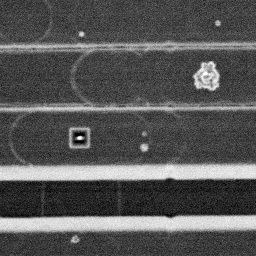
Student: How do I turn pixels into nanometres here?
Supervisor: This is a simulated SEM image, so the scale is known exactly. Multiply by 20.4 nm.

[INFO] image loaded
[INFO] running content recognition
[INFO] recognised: wiring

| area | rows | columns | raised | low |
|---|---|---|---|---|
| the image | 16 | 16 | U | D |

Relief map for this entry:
UUUUUUUUUUUUUUUU
UUUUUUUUUUUUUUUU
UUUUUUUUUUUUUUUU
UUUUUUUUUUUUUUUU
UUUUUUUUUUUUUUUU
UUUUUUUUUUUUUUUU
UUUUUUUUUUUUUUUU
UUUUUUUUUUUUUUUU
UUUUUUUUUUUUUUUU
UUUUUUUUUUUUUUUU
UUUUUUUUUUUUUUUU
DDDDDDDDDDDDDDDD
DDDDDDDDDDDDDDDD
DDDDDDDDDDDDDDDD
UUUUUUUUUUUUUUUU
UUUUUUUUUUUUUUUU